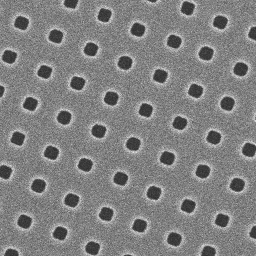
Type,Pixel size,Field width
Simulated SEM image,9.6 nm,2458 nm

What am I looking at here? a regular array of holes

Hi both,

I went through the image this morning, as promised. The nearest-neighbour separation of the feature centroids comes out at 342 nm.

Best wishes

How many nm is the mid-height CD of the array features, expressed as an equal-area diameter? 140